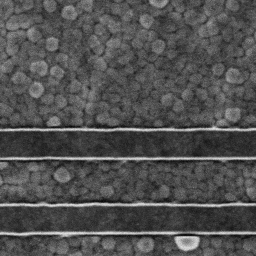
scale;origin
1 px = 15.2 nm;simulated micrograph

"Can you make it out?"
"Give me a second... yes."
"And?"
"one or a few lines or trenches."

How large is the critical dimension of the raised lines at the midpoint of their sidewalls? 443 nanometres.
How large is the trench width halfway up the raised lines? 690 nm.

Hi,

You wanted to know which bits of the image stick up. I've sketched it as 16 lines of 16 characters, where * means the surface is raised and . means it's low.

................
................
................
................
................
................
................
................
****************
****************
................
................
................
****************
****************
................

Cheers